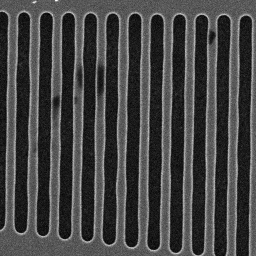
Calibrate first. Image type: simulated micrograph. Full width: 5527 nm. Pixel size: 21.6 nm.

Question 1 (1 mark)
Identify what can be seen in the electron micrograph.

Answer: groups of lines, slits or small figures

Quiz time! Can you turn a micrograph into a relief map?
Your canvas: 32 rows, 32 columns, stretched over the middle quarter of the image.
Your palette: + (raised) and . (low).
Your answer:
...++...++....++...+++...++...++
...++...++....++...+++...++...++
..+++...++....++...+++...++...++
..+++...++....++...+++...++...++
..+++...++....++...+++...++...++
..+++...++....++...+++...++...++
..+++...++....++...++....++...++
..+++...++....++...++....++...++
..+++...++....++...++....++...++
..+++...++....++...++....++...++
..+++...++....++...++....++...++
..+++...++....++...++....++...++
..+++...++....++...++....++...++
..+++...++....++...++....++...++
..+++...++...+++...++....++...++
..+++...++...+++...++....++...++
..+++...++...+++...++....++...++
..+++...++...+++...++....++...++
..+++...++...+++...++....++...++
..+++...++....++...++....++...++
..+++...++....++...++....++...++
..++....++....+....++....++...++
..++....++....+....++....++...++
..++....++....+....++....+....++
..++....++....+....++....+....++
..++....++....+....++....+....++
..++....++....+....++....+....++
..++....++...++....++...++....++
..++....++...++....++...++....++
..++....++...++....++...++....++
..++....++...++....++...++....++
..++....++...++....++...++....++